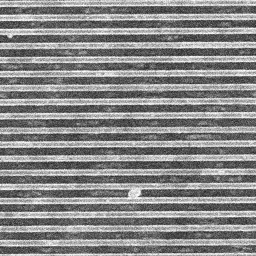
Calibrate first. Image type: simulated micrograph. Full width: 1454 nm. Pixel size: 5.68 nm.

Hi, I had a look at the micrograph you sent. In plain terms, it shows parallel lines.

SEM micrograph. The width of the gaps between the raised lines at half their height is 8.87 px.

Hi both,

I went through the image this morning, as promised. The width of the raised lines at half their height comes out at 29.8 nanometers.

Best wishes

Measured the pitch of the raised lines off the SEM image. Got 0.08 µm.